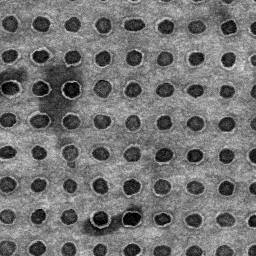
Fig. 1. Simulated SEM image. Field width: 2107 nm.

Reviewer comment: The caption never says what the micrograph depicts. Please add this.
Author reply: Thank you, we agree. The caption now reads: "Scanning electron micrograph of a regular array of holes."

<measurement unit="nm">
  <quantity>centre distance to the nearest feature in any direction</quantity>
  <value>254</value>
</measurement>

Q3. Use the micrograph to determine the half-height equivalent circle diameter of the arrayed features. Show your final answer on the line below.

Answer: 134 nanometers